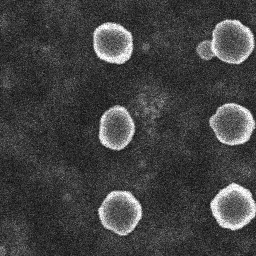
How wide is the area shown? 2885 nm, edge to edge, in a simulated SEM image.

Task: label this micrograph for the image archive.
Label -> raised bodies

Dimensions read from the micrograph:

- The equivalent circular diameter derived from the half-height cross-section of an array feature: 40.5 pixels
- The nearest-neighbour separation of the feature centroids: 956 nanometers